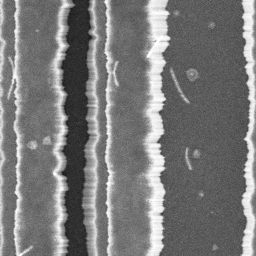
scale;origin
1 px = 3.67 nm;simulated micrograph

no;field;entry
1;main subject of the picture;lines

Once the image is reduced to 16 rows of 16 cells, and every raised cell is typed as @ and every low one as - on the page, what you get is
@@@@--@@@@------
@@@@--@@@@------
@@@@--@@@@------
@@@@--@@@@------
@@@@--@@@@------
@@@@--@@@@------
@@@@--@@@@------
@@@@--@@@@------
@@@@--@@@@------
@@@@--@@@@------
@@@@--@@@@------
@@@@--@@@@------
@@@@--@@@@-----@
@@@@--@@@@------
@@@@--@@@@------
@@@@--@@@@------